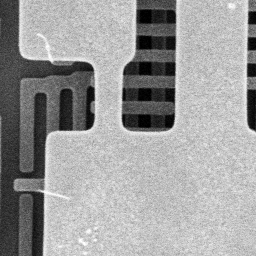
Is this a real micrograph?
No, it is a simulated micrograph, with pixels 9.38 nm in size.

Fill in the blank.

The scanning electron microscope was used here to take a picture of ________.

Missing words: wiring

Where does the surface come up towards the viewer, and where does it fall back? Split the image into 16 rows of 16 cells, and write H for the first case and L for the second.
LHHHHHHHLLLHHHHL
LHHHHHHHLLLHHHHL
LHHHHHHHLLLHHHHL
LLHHHHHHLLLHHHHL
LLLLLLHHLLLHHHHL
LLLLLLHHLLLHHHHL
LLLLLLHHLLLHHHHL
LLLLLLHHLLLHHHHL
LLLHHHHHHHHHHHHH
LLLHHHHHHHHHHHHH
LLLHHHHHHHHHHHHH
LLLHHHHHHHHHHHHH
LLLHHHHHHHHHHHHH
LLLHHHHHHHHHHHHH
LLLHHHHHHHHHHHHH
LLLHHHHHHHHHHHHH